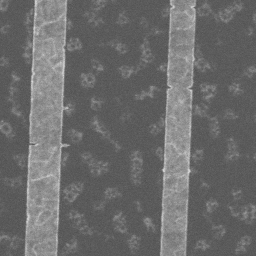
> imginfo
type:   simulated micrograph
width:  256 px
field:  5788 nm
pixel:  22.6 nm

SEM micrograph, one or a few lines or trenches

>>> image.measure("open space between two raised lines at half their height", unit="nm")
2350